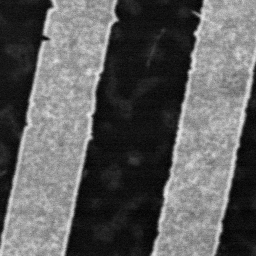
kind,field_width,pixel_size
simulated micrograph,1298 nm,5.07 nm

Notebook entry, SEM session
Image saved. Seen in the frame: one or a few lines or trenches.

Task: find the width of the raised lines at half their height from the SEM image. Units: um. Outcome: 0.305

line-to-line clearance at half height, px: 88.4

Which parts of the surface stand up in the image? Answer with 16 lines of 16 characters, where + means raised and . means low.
...++++......+++
...++++......+++
...++++.....++++
...+++......++++
..++++......++++
..++++......++++
..++++......+++.
..++++.....++++.
.+++++.....++++.
.++++......++++.
.++++......++++.
.++++......+++..
.++++.....++++..
++++......++++..
++++......++++..
++++......+++...